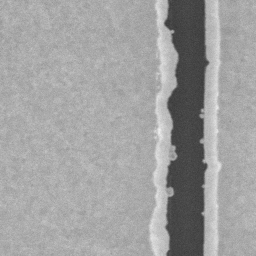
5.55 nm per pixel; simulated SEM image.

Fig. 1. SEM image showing one or a few lines or trenches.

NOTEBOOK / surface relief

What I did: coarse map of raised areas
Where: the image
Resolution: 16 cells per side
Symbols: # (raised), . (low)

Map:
##########...###
##########...###
##########...###
###########..###
###########..###
##########...###
##########...###
##########...###
##########...###
##########...###
##########...###
##########...###
##########...###
##########...###
##########...###
##########...###